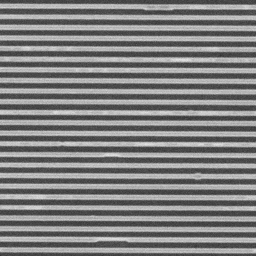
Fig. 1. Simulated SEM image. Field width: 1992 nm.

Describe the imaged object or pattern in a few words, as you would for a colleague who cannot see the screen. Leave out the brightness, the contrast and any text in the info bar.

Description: parallel lines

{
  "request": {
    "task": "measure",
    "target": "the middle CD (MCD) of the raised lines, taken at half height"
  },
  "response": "0.035 micrometres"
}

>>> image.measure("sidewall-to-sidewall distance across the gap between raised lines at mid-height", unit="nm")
48.6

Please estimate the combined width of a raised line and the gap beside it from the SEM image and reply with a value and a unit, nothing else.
10.6 pixels